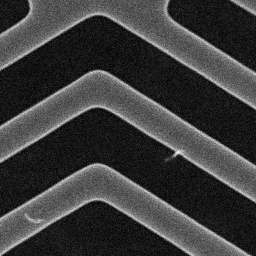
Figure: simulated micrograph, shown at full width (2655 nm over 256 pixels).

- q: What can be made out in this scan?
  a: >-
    groups of lines, slits or small figures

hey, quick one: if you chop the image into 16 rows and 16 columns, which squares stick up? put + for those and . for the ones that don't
..++++++++.....+
.++++..++++.....
+++......++++...
+..........+++..
......+.....++++
....++++......++
..++++++++......
.+++....+++.....
+++......++++...
+..........++++.
.....++......+++
....++++......++
..++++++++......
++++....++++....
++........+++...
+..........++++.